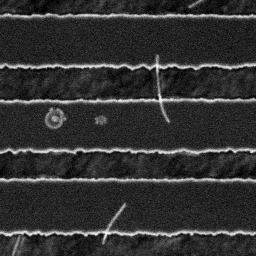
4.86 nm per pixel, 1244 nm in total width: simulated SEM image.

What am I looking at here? lines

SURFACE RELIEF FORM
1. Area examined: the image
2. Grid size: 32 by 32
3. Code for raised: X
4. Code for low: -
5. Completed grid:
--------------------------------
--------------------------------
XXXXXXXXXXXXXXXXXXXXXXXXXXXXXXXX
XXXXXXXXXXXXXXXXXXXXXXXXXXXXXXXX
XXXXXXXXXXXXXXXXXXXXXXXXXXXXXXXX
XXXXXXXXXXXXXXXXXXXXXXXXXXXXXXXX
XXXXXXXXXXXXXXXXXXXXXXXXXXXXXXXX
XXXXXXXXXXXXXXXXXXXXXXXXXXXXXXXX
----X-----------X-XXX---X---X---
--------------------------------
--------------------------------
--------------------------------
----------------XXXXXXXXXX-XXXXX
XXXXXXXXXXXXXXXXXXXXXXXXXXXXXXXX
XXXXXXXXXXXXXXXXXXXXXXXXXXXXXXXX
XXXXXXXXXXXXXXXXXXXXXXXXXXXXXXXX
XXXXXXXXXXXXXXXXXXXXXXXXXXXXXXXX
XXXXXXXXXXXXXXXXXXXXXXXXXXXXXXXX
XXXXXXXXXXXXXXXXXXXXXXXXXXXXXXXX
--------------------------------
--------------------------------
--------------------------------
XXXXXXXXXXXXXXXXXXXXXXXXXXXXXXXX
XXXXXXXXXXXXXXXXXXXXXXXXXXXXXXXX
XXXXXXXXXXXXXXXXXXXXXXXXXXXXXXXX
XXXXXXXXXXXXXXXXXXXXXXXXXXXXXXXX
XXXXXXXXXXXXXXXXXXXXXXXXXXXXXXXX
XXXXXXXXXXXXXXXXXXXXXXXXXXXXXXXX
XXXXXXXXXXXXXXXXXXXXXXXXXXXXXXXX
--------------------------------
--------------------------------
--------------------------------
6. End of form